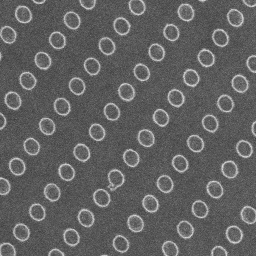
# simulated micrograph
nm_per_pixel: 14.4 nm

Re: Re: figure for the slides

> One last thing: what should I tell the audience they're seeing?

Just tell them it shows a regular array of raised bodies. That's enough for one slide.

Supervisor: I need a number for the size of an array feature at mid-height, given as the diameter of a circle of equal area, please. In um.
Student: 0.234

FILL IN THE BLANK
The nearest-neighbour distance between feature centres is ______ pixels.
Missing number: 24.8